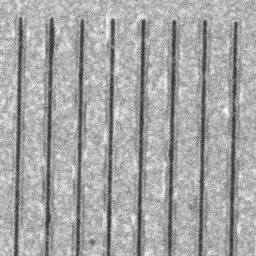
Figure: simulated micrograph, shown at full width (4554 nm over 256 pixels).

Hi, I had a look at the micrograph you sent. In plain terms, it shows parallel lines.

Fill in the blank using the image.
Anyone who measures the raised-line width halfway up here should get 122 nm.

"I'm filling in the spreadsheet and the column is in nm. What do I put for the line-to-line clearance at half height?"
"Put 427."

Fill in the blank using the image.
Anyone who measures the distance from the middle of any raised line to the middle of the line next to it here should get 547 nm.